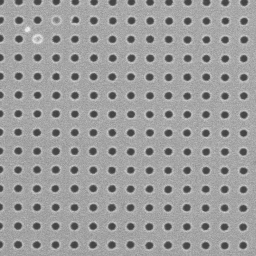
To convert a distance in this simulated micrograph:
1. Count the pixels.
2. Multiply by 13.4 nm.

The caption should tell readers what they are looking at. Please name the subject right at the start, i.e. a regular array of holes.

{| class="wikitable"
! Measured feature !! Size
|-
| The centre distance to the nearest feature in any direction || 0.245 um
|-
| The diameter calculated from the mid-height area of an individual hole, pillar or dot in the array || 108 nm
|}